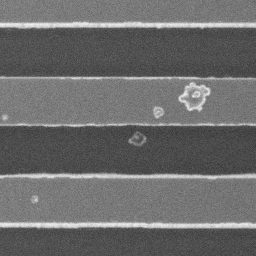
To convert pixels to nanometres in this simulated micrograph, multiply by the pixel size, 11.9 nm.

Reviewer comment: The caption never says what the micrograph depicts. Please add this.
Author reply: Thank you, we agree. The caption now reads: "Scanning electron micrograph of lines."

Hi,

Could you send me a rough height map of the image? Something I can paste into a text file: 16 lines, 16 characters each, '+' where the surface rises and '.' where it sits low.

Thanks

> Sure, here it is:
++++++++++++++++
++++++++++++++++
................
................
................
++++++++++++++++
++++++++++++++++
++++++++++++++++
................
................
................
++++++++++++++++
++++++++++++++++
++++++++++++++++
................
................